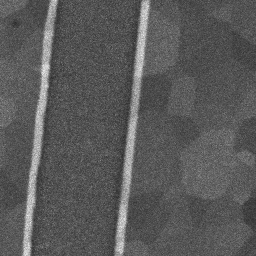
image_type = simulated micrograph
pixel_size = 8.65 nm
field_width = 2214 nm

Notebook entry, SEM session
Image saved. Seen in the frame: one or a few lines or trenches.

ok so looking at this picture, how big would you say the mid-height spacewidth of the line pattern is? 805 nm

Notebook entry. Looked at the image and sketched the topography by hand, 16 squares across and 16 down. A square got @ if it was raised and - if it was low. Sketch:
@@@------@@@@@@@
@@@------@@@@@@@
@@@------@@@@@@@
@@@------@@@@@@@
@@@------@@@@@@@
@@@------@@@@@@@
@@@-----@@@@@@@@
@@------@@@@@@@@
@@------@@@@@@@@
@@------@@@@@@@@
@@------@@@@@@@@
@@------@@@@@@@@
@@------@@@@@@@@
@@------@@@@@@@@
@@------@@@@@@@@
@@-----@@@@@@@@@